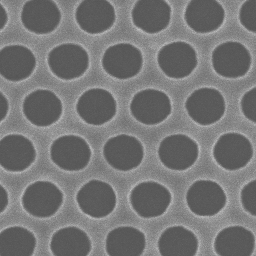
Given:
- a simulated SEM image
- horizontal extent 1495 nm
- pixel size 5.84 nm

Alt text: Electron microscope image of a regular array of holes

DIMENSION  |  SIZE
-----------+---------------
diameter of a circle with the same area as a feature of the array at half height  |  222 nanometers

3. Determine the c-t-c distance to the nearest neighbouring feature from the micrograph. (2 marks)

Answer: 52.9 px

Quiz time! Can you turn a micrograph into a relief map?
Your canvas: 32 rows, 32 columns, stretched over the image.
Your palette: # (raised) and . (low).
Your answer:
###....###....###....###...###..
.##....###....###....##.....##..
.##....###....###....##.....##..
###....###....###....###...####.
################################
########.######.#####..#####..##
....##.....##....###....###....#
....##.....##.....##.....##....#
....##.....##.....##....###....#
....###...####...####..#####..##
################################
####..#####...###...####...####.
.##....###....###....##.....##..
.##.....##.....#.....##.....##..
.##....###....###....###....###.
####..#####..#####..#####.######
################################
....###...####...###....###....#
....##.....##.....##.....##....#
....##.....##.....##.....##....#
....###....###...###....###....#
################################
################################
###....###....###....###....##..
.##.....##....##.....##.....##..
.##.....##....##.....##.....##..
####...###....###....###...####.
################################
#..#####..#####..####..#####...#
....###....##.....##....###.....
....##.....##.....##.....##.....
....###....##.....##....###.....